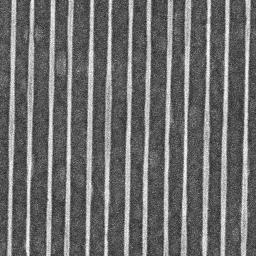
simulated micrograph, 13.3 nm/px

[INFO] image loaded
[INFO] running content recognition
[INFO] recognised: parallel lines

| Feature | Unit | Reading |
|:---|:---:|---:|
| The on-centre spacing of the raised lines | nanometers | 260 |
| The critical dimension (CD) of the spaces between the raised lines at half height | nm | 218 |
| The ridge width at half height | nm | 44.9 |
